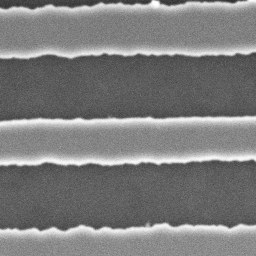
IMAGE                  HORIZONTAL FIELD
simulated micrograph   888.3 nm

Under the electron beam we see lines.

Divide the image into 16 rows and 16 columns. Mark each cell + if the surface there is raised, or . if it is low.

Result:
...+++++++++++++
++++++++++++++++
++++++++++++++++
++..+...........
................
................
................
..++++++++++++++
++++++++++++++++
++++++++++++++++
................
................
................
................
++++++++++++++++
++++++++++++++++